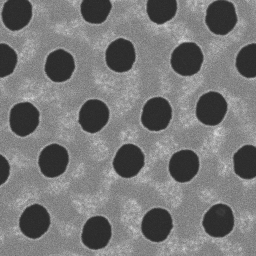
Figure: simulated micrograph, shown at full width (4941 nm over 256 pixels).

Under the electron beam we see a regular array of holes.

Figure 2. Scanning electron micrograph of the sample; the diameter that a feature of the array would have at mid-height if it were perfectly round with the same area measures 634 nanometres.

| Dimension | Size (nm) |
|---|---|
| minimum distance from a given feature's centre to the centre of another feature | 1090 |